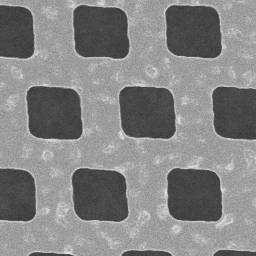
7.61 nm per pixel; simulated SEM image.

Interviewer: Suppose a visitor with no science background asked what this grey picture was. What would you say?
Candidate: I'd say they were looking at holes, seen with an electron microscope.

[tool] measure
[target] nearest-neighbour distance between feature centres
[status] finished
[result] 707 nanometers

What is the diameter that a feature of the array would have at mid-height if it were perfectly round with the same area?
58.2 px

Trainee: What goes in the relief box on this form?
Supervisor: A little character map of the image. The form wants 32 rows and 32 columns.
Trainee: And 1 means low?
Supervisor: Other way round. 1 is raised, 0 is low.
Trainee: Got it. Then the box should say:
11111111111111111111111111111111
00001111100000011111100000011111
00001111100000001111100000011111
00001111100000001111100000001111
00001111100000001111100000001111
00001111100000001111100000001111
00001111110000001111100000001111
11111111111111111111111111111111
11111111111111111111111111111111
11111111111111111111111111111111
11111111111111111111111111111111
11100000011111100000011111100000
11100000001111100000001111100000
11100000001111100000001111100000
11100000001111100000001111100000
11100000001111100000001111100000
11110000001111110000001111100000
11111111011111111111111111111111
11111111111111111111111111111111
11111111111111111111111111111111
11111111111111111111111111111111
00011111100000011111100000011111
00001111100000001111100000011111
00001111100000001111100000001111
00001111100000001111100000001111
00000111100000001111100000001111
00001111100000001111100000001111
00001111110000011111110000011111
11111111111111111111111111111111
11111111111111111111111111111111
11111111111111111111111111111111
11111111111111110000011111100000